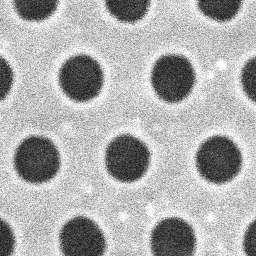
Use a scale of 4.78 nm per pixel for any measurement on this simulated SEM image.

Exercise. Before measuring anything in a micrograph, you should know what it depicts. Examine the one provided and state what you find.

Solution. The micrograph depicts holes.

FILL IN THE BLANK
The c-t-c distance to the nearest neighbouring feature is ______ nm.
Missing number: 437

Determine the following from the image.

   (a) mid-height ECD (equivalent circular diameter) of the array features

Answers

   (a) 235 nanometres